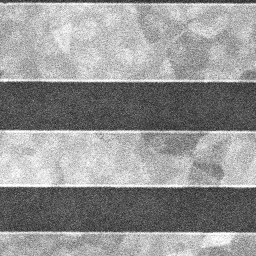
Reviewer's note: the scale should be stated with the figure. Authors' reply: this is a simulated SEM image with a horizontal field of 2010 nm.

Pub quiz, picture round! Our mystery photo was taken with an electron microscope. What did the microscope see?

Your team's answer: one or a few lines or trenches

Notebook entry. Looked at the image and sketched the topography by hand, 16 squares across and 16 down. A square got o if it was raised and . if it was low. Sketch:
oooooooooooooooo
oooooooooooooooo
oooooooooooooooo
oooooooooooooooo
oooooooooooooooo
................
................
................
oooooooooooooooo
oooooooooooooooo
oooooooooooooooo
oooooooooooooooo
................
................
................
oooooooooooooooo